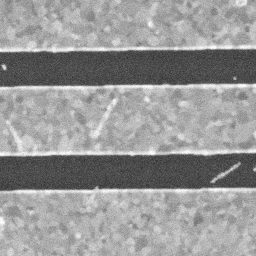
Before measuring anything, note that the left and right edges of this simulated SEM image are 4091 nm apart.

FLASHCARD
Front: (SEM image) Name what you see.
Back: lines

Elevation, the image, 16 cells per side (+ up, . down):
++++++++++++++++
++++++++++++++++
++++++++++++++++
................
................
++++++++++++++++
++++++++++++++++
++++++++++++++++
++++++++++++++++
++++++++++++++++
................
................
++++++++++++++++
++++++++++++++++
++++++++++++++++
++++++++++++++++